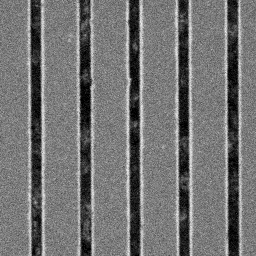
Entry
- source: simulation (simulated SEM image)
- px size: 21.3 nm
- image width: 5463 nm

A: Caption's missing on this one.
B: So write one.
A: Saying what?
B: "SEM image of parallel lines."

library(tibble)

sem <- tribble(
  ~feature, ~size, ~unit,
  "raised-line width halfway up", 0.779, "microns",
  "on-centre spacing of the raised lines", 1050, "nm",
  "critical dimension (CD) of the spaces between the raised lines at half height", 267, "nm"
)